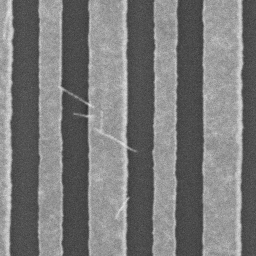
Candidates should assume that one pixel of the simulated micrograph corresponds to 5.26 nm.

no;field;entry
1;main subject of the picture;lines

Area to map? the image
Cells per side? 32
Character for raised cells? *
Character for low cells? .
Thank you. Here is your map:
*....***...*****...***...*****..
*....***...*****...***...*****..
**...***...*****...***...*****..
**...***...*****...***...*****..
**...***...*****...***...*****..
*....***...*****...***...*****..
*....***...*****...***...*****..
*....***...*****...***...*****..
*....***...*****...***...*****..
*....***...*****...***...*****..
*....***...*****...***...*****..
*....***...*****...***...*****..
*....***...*****...***...*****..
*....***...*****...***...*****..
*....***...*****...***...*****..
*....***...*****...***...*****..
*....***...*****...***....****..
*....***...*****...***....****..
*....***...*****...***...*****..
*....***...*****...***...*****..
*....***...*****...***...*****..
*....***...*****...***...*****..
*....***...*****...***...*****..
*....***...*****...***...*****..
*....***...*****...***...*****..
*....***...*****...***...*****..
*....***...*****...***...*****..
*....***...*****...***...*****..
*....***...*****...***...*****..
*....***...*****...***...*****..
*....***...*****...***...*****..
*....***...*****...***...*****..